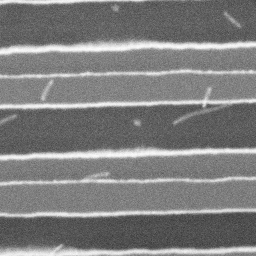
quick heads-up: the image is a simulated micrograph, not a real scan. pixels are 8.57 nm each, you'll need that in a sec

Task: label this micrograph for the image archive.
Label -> lines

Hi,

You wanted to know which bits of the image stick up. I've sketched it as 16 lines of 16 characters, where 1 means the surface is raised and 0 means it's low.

0000000000000000
0000000000000000
0000000000000000
1111111111111111
1111111111111111
1111111111111111
1111111110000000
0000000000000000
0000000000000000
0000000000000010
1111111111111111
1111111111111111
1111111111111111
0000000000000000
0000000000000000
0000000000000000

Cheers